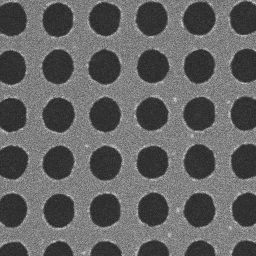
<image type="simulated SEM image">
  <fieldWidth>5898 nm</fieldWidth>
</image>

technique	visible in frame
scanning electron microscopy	a regular array of holes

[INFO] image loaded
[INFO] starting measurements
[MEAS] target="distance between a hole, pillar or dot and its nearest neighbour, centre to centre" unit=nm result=1080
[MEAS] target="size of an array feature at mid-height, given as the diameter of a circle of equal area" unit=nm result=770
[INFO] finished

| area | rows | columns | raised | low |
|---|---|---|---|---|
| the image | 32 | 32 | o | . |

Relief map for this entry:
..ooooo.oooo..oooo..oooo..oooo..
...oo....oo....oo....oo....oo...
...oo....oo....oo....oo....oo...
...oo....oo....oo....oo....oo...
o.oooo..ooooo.oooooooooooooooooo
oooooooooooooooooooooooooooooooo
..oooo..oooo..oooo..oooo..oooo..
...oo....oo....oo....oo....oo...
...oo....oo....oo....oo....oo...
...oo....oo....oo....oo...ooo...
o.ooooo.oooooooooooooooooooooooo
oooooooooooooooooooooooooooooooo
..oooo..oooo..oooo..oooo..oooo..
...ooo...oo....oo....oo....oo...
...oo....oo....oo....oo....oo...
...ooo...oo....oo....oo....oo...
o.ooooo.oooooooooooooooooooooooo
oooooooooooooooooooooooooooooooo
...ooo..oooo..oooo..oooo..oooo..
....oo...oo....oo....oo....oo...
...oo....oo....oo....oo....oo...
...ooo...oo....oo....oo....oo...
o.ooooooooooo.oooooooooooooooooo
oooooooooooooooooooooooooooooooo
...ooo..oooo..oooo..oooo..oooo..
...ooo...oo....oo....oo....oo...
...oo....oo....oo....oo....oo...
...ooo...ooo...ooo...oo....oo...
oooooooooooooooooooooooooooooooo
oooooooooooooooooooooooooooooooo
o..ooo..oooo..oooo...ooo..oooo..
...ooo...oo....oo....oo....oo...